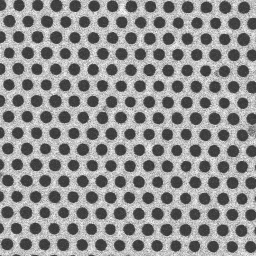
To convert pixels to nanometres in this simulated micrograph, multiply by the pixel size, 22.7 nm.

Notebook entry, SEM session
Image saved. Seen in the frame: a regular array of holes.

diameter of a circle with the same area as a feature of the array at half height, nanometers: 272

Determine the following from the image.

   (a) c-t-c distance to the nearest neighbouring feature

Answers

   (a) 412 nanometres